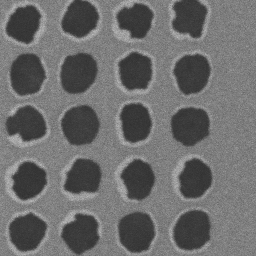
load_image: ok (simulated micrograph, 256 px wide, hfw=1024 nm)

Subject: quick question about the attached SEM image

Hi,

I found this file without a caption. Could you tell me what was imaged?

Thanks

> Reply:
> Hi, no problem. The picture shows a regular array of holes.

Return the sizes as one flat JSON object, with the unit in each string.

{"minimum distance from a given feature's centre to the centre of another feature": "0.206 microns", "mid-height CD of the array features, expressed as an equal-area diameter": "147 nanometres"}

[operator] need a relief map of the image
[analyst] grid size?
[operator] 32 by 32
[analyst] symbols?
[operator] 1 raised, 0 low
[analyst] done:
11111111100111111011110001111111
11000111000011100001110000111111
10000111000011100001110000111111
10000111000011100001110001111111
10001111100111110011111101111111
11111111111111111111111111111111
11111111111111111111111111111111
11000111000011100001110000111111
10000111000011100001110000111111
10000010000011100001110000111111
10000111000011100001110000111111
11000111000111111111111001111111
11111111111111111111111111111111
11101111100111100011111001111111
10000111000011100001110000111111
10000011000011100001100000111111
10000011000011100001100000111111
11101111000011110011110001111111
11111111111111111111111111111111
11111111111111111111111111111111
11101111100011110011111000111111
11000011100001100001111000111111
11000011000001100001110000011111
11000111000011110001110000111111
11001111111111110011111001111111
11111111111111111111111111111111
11111111111111111111111001111111
11000111100011100001110000111111
10000011000011100001110000111111
10000011000011100001110000111111
11000111000011100001110000111111
11111111100111110011111111111111